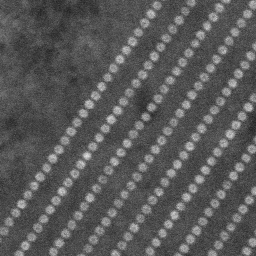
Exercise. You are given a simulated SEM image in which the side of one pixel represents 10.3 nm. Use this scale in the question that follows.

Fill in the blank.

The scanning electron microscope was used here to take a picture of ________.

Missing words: a regular array of raised bodies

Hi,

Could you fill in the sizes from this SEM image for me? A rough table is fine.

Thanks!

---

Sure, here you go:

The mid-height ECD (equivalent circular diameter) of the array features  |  72.8 nm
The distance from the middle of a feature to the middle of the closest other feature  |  111 nanometers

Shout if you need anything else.